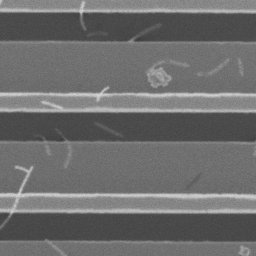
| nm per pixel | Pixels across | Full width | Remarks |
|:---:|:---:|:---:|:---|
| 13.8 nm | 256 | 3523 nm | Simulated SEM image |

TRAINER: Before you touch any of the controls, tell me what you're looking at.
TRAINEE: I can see lines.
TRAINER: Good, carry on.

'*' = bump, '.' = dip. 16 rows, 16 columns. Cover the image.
****************
................
................
****************
****************
****************
****************
................
................
****************
****************
****************
****************
................
................
****************